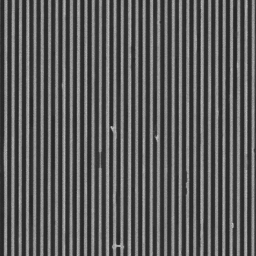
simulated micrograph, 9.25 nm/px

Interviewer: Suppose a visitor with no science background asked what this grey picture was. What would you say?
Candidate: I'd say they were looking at parallel lines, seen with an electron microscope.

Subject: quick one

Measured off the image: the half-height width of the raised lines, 31.2 nm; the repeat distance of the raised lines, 67.3 nanometres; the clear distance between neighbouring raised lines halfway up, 4.13 px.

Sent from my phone